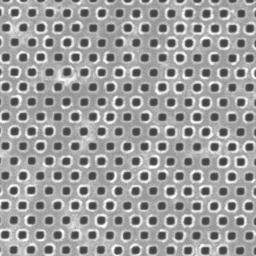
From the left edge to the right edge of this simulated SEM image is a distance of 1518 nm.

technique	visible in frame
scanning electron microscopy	a regular array of holes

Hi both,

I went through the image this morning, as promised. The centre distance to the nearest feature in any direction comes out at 0.1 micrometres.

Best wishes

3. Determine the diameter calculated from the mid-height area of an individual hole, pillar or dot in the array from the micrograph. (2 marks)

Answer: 50.9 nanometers